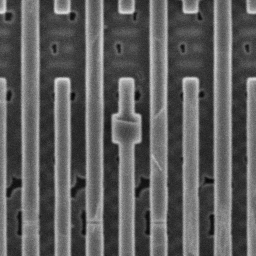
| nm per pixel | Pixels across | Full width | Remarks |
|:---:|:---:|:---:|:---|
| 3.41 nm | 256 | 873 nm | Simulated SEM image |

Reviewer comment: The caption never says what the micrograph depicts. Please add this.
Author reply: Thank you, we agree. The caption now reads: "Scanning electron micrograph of wiring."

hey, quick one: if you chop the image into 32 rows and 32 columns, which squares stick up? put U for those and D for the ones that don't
UDDUUDDUUDDUUDDUUDDUUDDUUDDUUDDU
DDDUUDDUDDDUUDDUDDDUUDDDDDDUUDDD
DDDUUDDDDDDUUDDDDDDUUDDDDDDUUDDD
DDDUUDDDDDDUUDDDDDDUUDDDDDDUUDDD
DDDUUDDDDDDUUDDDDDDUUDDDDDDUUDDD
DDDUUDDDDDDUUDDDDDDUUDDDDDDUUDDD
DDDUUDDDDDDUUDDDDDDUUDDDDDDUUDDD
DDDUUDDDDDDUUDDDDDDUUDDDDDDUUDDD
DDDUUDDDDDDUUDDDDDDUUDDDDDDUUDDD
DDDUUDDDDDDUUDDDDDDUUDDDDDDUUDDD
UDDUUDDUUDDUUDDUUDDUUDDUUDDUUDDU
DDDUUDDUUDDUUDDUUDDUUDDUUDDUUDDU
DDDUUDDUUDDUUDDUUDDUUDDUUDDUUDDU
UDDUUDDUUDDUUDDUUDDUUDDUUDDUUDDU
UDDUUDDUUDDUUDUUUDDUUDDUUDDUUDDU
UDDUUDDUUDDUUDUUUUDUUDDUUDDUUDDU
UDDUUDDUUDDUUDUUUUDUUDDUUDDUUDDU
UDDUUDDUUDDUUDUUUDDUUDDUUDDUUDDU
UDDUUDDUUDDUUDDUUDDUUDDUUDDUUDDU
UDDUUDDUUDDUUDDUUDDUUDDUUDDUUDDU
UDDUUDDUUDDUUDDUUDDUUDDUUDDUUDDU
UDDUUDDUUDDUUDDUUDDUUDDUUDDUUDDU
UDDUUDDUUDDUUDDUUDDUUDDUUDDUUDDU
UDDUUDDUUDDUUDDUUDDUUDDUUDDUUDDU
UDDUUDDUUDDUUDDUUDDUUDDUUDDUUDDU
UDDUUDDUUDDUUDDUUDDUUDDUUDDUUDDU
UDDUUDDUUDDUUDDUUDDUUDDUUDDUUDDU
UDDUUDDUUDDUUDDUUDDUUDDUUDDUUDDU
UDDUUDDUUDDUUDDUUDDUUDDUUDDUUDDU
UDDUUDDUUDDUUDDUUDDUUDDUUDDUUDDU
UDDUUDDUUDDUUDDUUDDUUDDUUDDUUDDU
UDDUUDDUUDDUUDDUUDDUUDDUUDDUUDDU